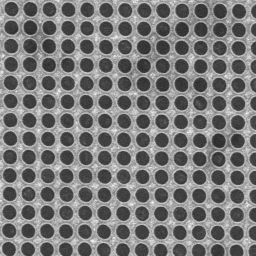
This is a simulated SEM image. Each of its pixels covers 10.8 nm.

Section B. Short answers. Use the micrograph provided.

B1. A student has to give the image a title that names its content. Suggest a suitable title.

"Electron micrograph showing a regular array of holes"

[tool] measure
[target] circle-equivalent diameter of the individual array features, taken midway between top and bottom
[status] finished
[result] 159 nm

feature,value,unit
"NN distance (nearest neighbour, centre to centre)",199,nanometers